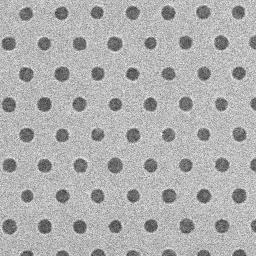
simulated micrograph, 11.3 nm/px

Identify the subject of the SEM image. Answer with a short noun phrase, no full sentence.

a regular array of holes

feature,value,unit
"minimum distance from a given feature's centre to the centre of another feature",394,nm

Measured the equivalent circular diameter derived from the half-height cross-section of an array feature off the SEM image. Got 167 nanometres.